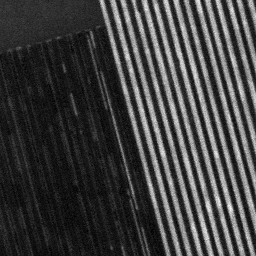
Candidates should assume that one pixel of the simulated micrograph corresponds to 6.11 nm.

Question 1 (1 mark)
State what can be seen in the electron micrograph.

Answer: parallel lines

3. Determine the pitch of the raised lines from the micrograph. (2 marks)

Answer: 62.6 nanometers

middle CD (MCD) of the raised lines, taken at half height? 27.3 nm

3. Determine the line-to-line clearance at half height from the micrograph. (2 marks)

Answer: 0.0384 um